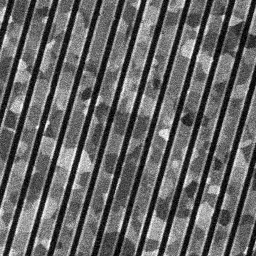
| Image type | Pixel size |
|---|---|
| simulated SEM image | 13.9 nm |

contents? parallel lines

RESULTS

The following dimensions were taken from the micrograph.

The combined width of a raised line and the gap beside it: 296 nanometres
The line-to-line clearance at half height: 6.98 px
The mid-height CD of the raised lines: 194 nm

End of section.